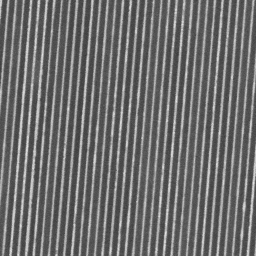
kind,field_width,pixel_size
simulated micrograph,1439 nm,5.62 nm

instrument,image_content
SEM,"parallel lines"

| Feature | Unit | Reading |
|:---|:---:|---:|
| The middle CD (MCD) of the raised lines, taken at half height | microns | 0.0112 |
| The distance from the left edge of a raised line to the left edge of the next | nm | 42.9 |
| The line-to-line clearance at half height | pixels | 5.85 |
